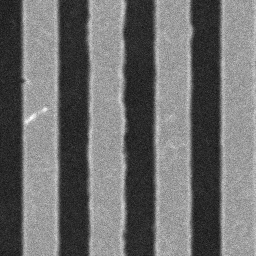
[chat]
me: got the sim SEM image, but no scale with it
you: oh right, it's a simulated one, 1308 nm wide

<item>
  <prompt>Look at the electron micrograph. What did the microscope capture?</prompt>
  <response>one or a few lines or trenches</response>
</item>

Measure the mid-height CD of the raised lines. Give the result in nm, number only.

182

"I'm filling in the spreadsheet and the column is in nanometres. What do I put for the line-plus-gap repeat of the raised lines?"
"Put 339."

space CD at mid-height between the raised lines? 30.5 px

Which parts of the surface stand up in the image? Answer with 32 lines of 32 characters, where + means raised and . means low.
...++++....+++++...+++++....++++
...++++....+++++...+++++....++++
...++++....+++++...+++++....++++
...++++....++++....+++++....++++
...++++....++++....+++++....++++
...++++....+++++...+++++....++++
...++++....+++++...+++++....++++
...++++....+++++...+++++....++++
...++++....++++....+++++....++++
...++++....++++....+++++....++++
...++++....++++....+++++....++++
...++++....++++....+++++....++++
...++++....++++....+++++....++++
...++++....+++++...+++++....++++
...++++....+++++...+++++....++++
...++++....+++++...+++++....++++
...++++....+++++...+++++....++++
...++++....++++....+++++....++++
...++++....++++....+++++....++++
...++++....+++++...+++++....++++
...++++....+++++...+++++....++++
...++++....+++++...+++++....++++
...++++....+++++...+++++....++++
...++++....+++++....++++....++++
...++++....+++++...+++++....++++
...++++....+++++....++++....++++
...++++....+++++....++++....++++
...++++....+++++...+++++....++++
...++++....+++++...+++++....++++
...++++....++++....+++++....++++
...++++....+++++...+++++....++++
...++++....+++++...+++++....++++